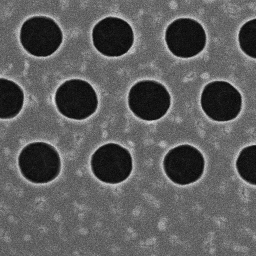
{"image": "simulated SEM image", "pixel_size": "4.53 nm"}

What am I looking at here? a regular array of holes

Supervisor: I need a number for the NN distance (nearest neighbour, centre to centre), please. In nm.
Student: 327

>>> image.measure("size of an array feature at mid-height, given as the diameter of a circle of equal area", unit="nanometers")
182